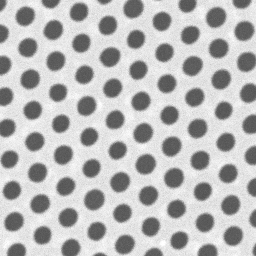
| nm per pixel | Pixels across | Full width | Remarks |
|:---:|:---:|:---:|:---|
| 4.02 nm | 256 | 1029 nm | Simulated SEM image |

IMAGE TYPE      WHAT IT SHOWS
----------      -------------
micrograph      a regular array of holes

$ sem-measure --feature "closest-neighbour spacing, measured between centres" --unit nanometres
125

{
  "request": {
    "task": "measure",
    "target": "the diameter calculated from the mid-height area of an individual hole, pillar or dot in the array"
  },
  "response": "78.2 nm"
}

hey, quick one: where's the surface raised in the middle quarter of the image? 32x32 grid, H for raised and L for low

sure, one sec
HHHHLLHHHHLLLHHHLLLLLHHHHHHHHHLL
HHHLLLLHHHHHHHHHLLLLLHHHHHHHHHLL
HHHLLLLLHHHHHHHHLLLLLHHHHLHHHHLL
HHHLLLLHHHHHLHHHHLLLHHHHLLLLHHHH
HHHHLLHHHHHLLLHHHHHHHHHLLLLLHHHH
HHHHHHHHHHLLLLLHHHHHHHHLLLLLHHHH
LHHHHHHHHHLLLLLHHHHHHHHHLLLLHHHL
LHHHHHHHHHLLLLHHHHLLLHHHHHHHHHLL
HHHHLLLHHHHLHHHHHLLLLLHHHHHHHHLL
HHHHLLLLHHHHHHHHHLLLLLHHHHHHHHLL
HHHLLLLLHHHHHHHHHLLLLHHHHHLHHHHL
HHHLLLLLHHHHHHHHHHLLHHHHHLLLHHHH
HHHHLLLHHHHLLLLHHHHHHHHHLLLLLHHH
LHHHHHHHHHLLLLLHHHHHHHHHLLLLLHHH
LLHHHHHHHHLLLLLHHHHHHHHHHLLLHHHH
LHHHHHHHHHHLLLLHHHLLLLHHHHHHHHHL
LHHHHLLLHHHHHHHHHHLLLLHHHHHHHHHL
HHHHLLLLLHHHHHHHHLLLLLHHHHHHHHHL
HHHHLLLLLHHHHHHHHLLLLLHHHHLLLHHH
HHHHLLLLHHHHHLLHHHLLLHHHHLLLLHHH
LHHHHLLHHHHHLLLLHHHHHHHHLLLLLHHH
LLHHHHHHHHHLLLLLHHHHHHHHLLLLLHHH
LLHHHHHHHHHLLLLHHHHHLHHHHLLLHHHH
LLHHHHHHHHHHLLHHHHHLLLLHHHHHHHHH
LHHHHLLLLHHHHHHHHHLLLLLHHHHHHHHH
HHHHHLLLLHHHHHHHHHLLLLLHHHHHHHHH
HHHHLLLLLHHHHHHHHHLLLLLHHHLLLHHH
HHHHHLLLLHHHHLLLHHHLLHHHHLLLLLHH
LLHHHHLHHHHHLLLLHHHHHHHHHLLLLLHH
LLLHHHHHHHHLLLLLLHHHHHHHHLLLLLHH
LLLHHHHHHHHHLLLLHHHHHLHHHHLLLHHH
LLHHHHHLLHHHLLLHHHHLLLLHHHHHHHHH